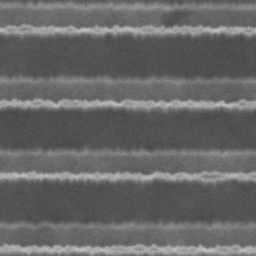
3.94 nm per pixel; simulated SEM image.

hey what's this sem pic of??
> lines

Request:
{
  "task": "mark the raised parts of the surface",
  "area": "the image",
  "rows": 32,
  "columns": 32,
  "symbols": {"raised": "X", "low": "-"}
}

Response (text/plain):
--------------------------------
XXXXXXXXXXXXXXXXXXXXXXXXXXXXXXXX
XXXXXXXXXXXXXXXXXXXXXXXXXXXXXXXX
XXXXXXXXXXXXXXXXXXXXXXXXXXXXXXXX
--------------------------------
--------------------------------
--------------------------------
--------------------------------
--------------------------------
--------------------------------
XXXXXXXXXXXXXXXXXXXXXXXXXXXXXXXX
XXXXXXXXXXXXXXXXXXXXXXXXXXXXXXXX
XXXXXXXXXXXXXXXXXXXXXXXXXXXXXXXX
------------------X-------------
--------------------------------
--------------------------------
--------------------------------
--------------------------------
--------------------------------
XXXXXXXXXXXXXXXXXXXXXXXXXXXXXXXX
XXXXXXXXXXXXXXXXXXXXXXXXXXXXXXXX
XXXXXXXXXXXXXXXXXXXXXXXXXXXXXXXX
-------------------------XXX----
--------------------------------
--------------------------------
--------------------------------
--------------------------------
--------------------------------
XXXXXXXXXXXXXXXXXXXXXXXXXXXXXXXX
XXXXXXXXXXXXXXXXXXXXXXXXXXXXXXXX
XXXXXXXXXXXXXXXXXXXXXXXXXXXXXXXX
X--XX-XXX--XXXXXXXXXXXXXXXXXXXXX